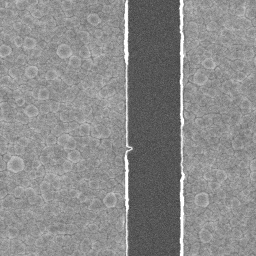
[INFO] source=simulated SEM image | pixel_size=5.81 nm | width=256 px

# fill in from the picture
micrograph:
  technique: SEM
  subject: one or a few lines or trenches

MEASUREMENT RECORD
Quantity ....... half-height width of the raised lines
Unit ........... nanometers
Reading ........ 330